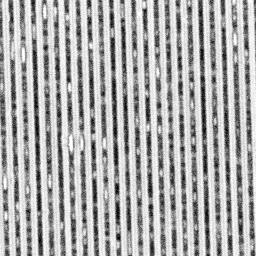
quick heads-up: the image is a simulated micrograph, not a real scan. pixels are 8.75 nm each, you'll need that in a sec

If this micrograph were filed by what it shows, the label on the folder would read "parallel lines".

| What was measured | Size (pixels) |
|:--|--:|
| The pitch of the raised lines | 11.2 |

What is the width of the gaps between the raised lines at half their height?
54.6 nm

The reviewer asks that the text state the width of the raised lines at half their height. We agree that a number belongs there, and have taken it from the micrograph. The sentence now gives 39.3 nm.